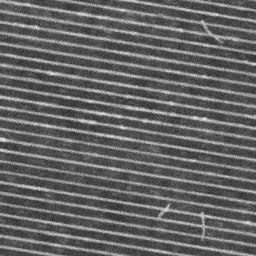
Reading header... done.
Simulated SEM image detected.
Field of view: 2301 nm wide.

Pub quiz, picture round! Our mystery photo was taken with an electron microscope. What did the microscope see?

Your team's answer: parallel lines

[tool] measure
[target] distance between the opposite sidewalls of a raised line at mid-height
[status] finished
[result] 0.0155 microns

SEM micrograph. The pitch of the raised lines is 0.0949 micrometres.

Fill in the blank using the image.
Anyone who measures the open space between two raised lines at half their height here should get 76.6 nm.